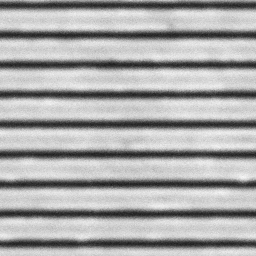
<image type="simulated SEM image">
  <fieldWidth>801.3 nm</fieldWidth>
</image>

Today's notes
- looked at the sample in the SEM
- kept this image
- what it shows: parallel lines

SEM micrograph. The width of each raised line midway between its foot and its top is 64.9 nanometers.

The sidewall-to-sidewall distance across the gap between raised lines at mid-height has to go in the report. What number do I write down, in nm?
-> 27.4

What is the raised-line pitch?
0.0932 microns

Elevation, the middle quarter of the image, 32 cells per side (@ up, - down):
--------------------------------
@@@@@@@@@@@@@@@@@@@@@@@@@@@@@@@@
@@@@@@@@@@@@@@@@@@@@@@@@@@@@@@@@
@@@@@@@@@@@@@@@@@@@@@@@@@@@@@@@@
@@@@@@@@@@@@@@@@@@@@@@@@@@@@@@@@
@@@@@@@@@@@@@@@@@@@@@@@@@@@@@@@@
---------------------------@@@@-
--------------------------------
--------------------------------
@@@@@@@@@@@@@@@@@@@@@@@@@@@@@@@@
@@@@@@@@@@@@@@@@@@@@@@@@@@@@@@@@
@@@@@@@@@@@@@@@@@@@@@@@@@@@@@@@@
@@@@@@@@@@@@@@@@@@@@@@@@@@@@@@@@
@@@@@@@@@@@@@@@@@@@@@@@@@@@@@@@@
--------------------------------
--------------------------------
@@@@@@@@@@@@@@@@@@@@@@@@@@@@@@@@
@@@@@@@@@@@@@@@@@@@@@@@@@@@@@@@@
@@@@@@@@@@@@@@@@@@@@@@@@@@@@@@@@
@@@@@@@@@@@@@@@@@@@@@@@@@@@@@@@@
@@@@@@@@@@@@@@@@@@@@@@@@@@@@@@@@
--------------------------------
--------------------------------
--------------------------------
@@@@@@@@@@@@@@@@@@@@@@@@@@@@@@@@
@@@@@@@@@@@@@@@@@@@@@@@@@@@@@@@@
@@@@@@@@@@@@@@@@@@@@@@@@@@@@@@@@
@@@@@@@@@@@@@@@@@@@@@@@@@@@@@@@@
@@@@@@@@@@@@@@@@@@@@@@@@@@@@@@@@
--------------------------------
--------------------------------
@@@@@@@@@@@@@@@@@@@@@@@@@@@@@@@@